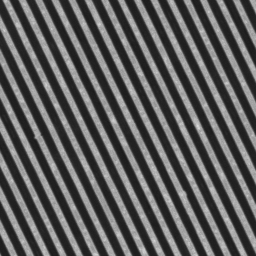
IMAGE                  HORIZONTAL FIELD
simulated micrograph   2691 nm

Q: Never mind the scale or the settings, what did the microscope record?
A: parallel lines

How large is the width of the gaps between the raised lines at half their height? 79.4 nanometres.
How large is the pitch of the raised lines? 156 nm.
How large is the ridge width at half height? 79.4 nm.